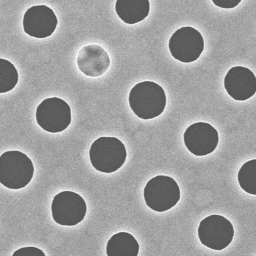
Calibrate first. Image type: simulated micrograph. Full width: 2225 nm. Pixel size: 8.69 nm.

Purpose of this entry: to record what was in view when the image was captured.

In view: a regular array of holes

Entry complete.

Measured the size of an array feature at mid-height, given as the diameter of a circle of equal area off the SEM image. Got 309 nm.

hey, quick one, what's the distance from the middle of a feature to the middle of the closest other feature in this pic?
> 580 nanometers